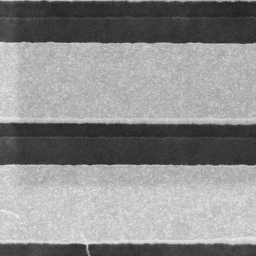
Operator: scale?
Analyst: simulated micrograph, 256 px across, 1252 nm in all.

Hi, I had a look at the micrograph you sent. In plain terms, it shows lines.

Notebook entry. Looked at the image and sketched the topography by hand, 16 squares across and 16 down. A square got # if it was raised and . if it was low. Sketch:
................
................
................
################
################
################
################
################
................
................
################
################
################
################
################
................